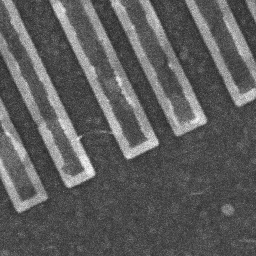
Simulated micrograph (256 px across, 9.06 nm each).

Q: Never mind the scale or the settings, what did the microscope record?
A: one or a few lines or trenches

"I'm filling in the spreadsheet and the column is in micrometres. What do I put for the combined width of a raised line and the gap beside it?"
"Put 0.548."